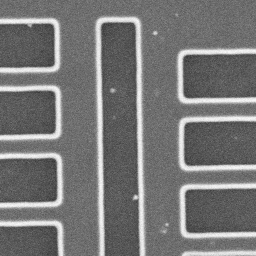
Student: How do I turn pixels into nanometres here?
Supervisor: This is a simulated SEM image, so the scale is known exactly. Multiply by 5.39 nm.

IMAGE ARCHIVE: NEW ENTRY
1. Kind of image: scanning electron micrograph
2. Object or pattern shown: groups of lines, slits or small figures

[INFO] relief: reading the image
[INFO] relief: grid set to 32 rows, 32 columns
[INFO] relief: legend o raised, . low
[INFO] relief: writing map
oooooooooooooooooooooooooooooooo
oooooooooooooooooooooooooooooooo
oooooooooooooo..oooooooooooooooo
.......ooooo.....ooooooooooooooo
.......ooooo.....ooooooooooooooo
.......ooooo.....ooooooooooooooo
.......ooooo.....oooooooooo.o...
.......ooooo.....oooooo.........
.......ooooo.....oooooo.........
oooooooooooo.....oooooo.........
oooooooooooo.....oooooo.........
.......ooooo.....oooooo.........
.......ooooo.....ooooooo...ooooo
.......ooooo.....ooooooooooooooo
.......oooooo....ooooooooooooooo
.......oooooo....oooooo.........
.......oooooo....oooooo.........
ooooooooooooo....oooooo.........
ooooooooooooo....oooooo.........
ooooooooooooo....oooooo.........
.......oooooo....oooooo.........
.......oooooo.....oooooooooooooo
.......oooooo.....oooooooooooooo
.......oooooo.....oooooo........
.......oooooo.....ooooo.........
......ooooooo.....ooooo.........
ooooooooooooo.....ooooo.........
ooooooooooooo.....ooooo.........
.......oooooo.....ooooo.........
........ooooo.....oooooooooooooo
........ooooo.....oooooooooooooo
........ooooo.....oooooooooooooo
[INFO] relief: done